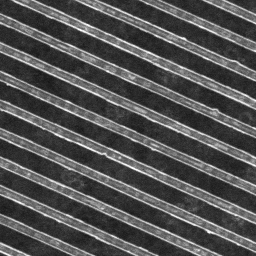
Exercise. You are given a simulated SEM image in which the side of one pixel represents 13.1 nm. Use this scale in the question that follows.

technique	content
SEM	parallel lines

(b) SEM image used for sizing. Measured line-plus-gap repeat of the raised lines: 0.341 um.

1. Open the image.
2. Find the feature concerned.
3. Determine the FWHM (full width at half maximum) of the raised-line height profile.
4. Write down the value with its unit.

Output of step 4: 243 nm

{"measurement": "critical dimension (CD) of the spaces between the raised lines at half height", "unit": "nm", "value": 104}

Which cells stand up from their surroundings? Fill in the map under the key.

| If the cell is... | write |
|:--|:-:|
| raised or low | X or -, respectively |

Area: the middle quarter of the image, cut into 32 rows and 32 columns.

XXXXXXXX-----XXXXXXXXXXX-----XXX
XXXXXXXXXX-----XXXXXXXXXXX-----X
-XXXXXXXXXXX-----XXXXXXXXXXXX---
---XXXXXXXXXXXX-----XXXXXXXXXXX-
X-----XXXXXXXXXXX-----XXXXXXXXXX
XXX-----XXXXXXXXXXX-----XXXXXXXX
XXXXXX----XXXXXXXXXXX-----XXXXXX
XXXXXXXX----XXXXXXXXXXXX-----XXX
XXXXXXXXXX-----XXXXXXXXXXX-----X
-XXXXXXXXXXX-----XXXXXXXXXXX----
---XXXXXXXXXXXX----XXXXXXXXXXX--
X-----XXXXXXXXXXX-XX-XXXXXXXXXXX
XXX-----XXXXXXXXXXX----XXXXXXXXX
XXXXX-----XXXXXXXXXXX-----XXXXXX
XXXXXXX-----XXXXXXXXXXX-----XXXX
XXXXXXXXX-----XXXXXXXXXXXX----XX
-XXXXXXXXXXX-----XXXXXXXXXXX----
---XXXXXXXXXXX-----XXXXXXXXXXX--
-----XXXXXXXXXXXX----XXXXXXXXXXX
XXX-----XXXXXXXXXXX----XXXXXXXXX
XXXXX-----XXXXXXXXXXX----XXXXXXX
XXXXXXX-----XXXXXXXXXX------XXXX
XXXXXXXXXX----XXXXXXXXXXX-----XX
XXXXXXXXXXXX----XXXXXXXXXXX-----
---XXXXXXXXXXX----XXXXXXXXXXX---
-----XXXXXXXXXXX-----XXXXXXXXXXX
XXX----XXXXXXXXXXX-----XXXXXXXXX
XXXXX----XXXXXXXXXXX-----XXXXXXX
XXXXXXX-----XXXXXXXXXXX----XXXXX
XXXXXXXXX-----XXXXXXXXXXX----XXX
XXXXXXXXXXX-----XXXXXXXXXXX-----
--XXXXXXXXXXXX----XXXXXXXXXXX---